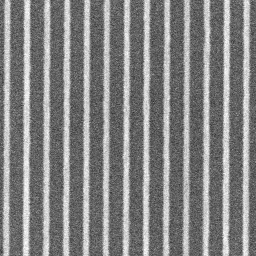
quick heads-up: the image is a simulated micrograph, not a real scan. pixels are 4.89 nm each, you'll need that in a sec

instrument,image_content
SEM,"parallel lines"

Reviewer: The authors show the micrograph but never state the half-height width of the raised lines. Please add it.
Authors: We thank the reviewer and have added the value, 21.4 nanometres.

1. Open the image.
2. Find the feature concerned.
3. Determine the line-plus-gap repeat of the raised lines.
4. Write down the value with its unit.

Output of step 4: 0.0977 um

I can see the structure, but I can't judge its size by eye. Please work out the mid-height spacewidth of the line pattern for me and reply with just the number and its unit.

77.1 nanometers